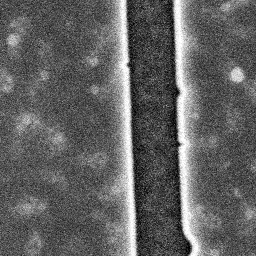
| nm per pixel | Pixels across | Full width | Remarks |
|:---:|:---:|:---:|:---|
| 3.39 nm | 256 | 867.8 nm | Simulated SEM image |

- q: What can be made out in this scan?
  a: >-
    one or a few lines or trenches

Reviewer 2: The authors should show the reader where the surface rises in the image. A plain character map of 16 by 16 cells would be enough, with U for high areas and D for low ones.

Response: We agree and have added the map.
UUUUUUUUDDDUUUUU
UUUUUUUUDDDUUUUU
UUUUUUUUDDDUUUUU
UUUUUUUUDDDUUUUU
UUUUUUUUDDDUUUUU
UUUUUUUUDDDUUUUU
UUUUUUUUDDDUUUUU
UUUUUUUUDDDUUUUU
UUUUUUUUDDDUUUUU
UUUUUUUUDDDUUUUU
UUUUUUUUDDDUUUUU
UUUUUUUUDDDUUUUU
UUUUUUUUDDDUUUUU
UUUUUUUUDDDUUUUU
UUUUUUUUDDDDUUUU
UUUUUUUUDDDDUUUU